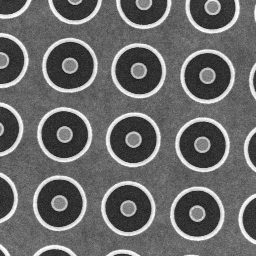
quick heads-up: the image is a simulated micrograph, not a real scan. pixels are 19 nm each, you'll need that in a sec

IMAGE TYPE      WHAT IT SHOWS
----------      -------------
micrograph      an array of small figures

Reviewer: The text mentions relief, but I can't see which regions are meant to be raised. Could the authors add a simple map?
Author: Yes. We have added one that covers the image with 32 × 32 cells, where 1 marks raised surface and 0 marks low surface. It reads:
00011100000011100110011100100011
00111110000011100000011100100011
11111111000111110000111100000111
11111111111111111111111110001111
01111111111111111111111111111111
00111110001111111111111111111111
00011100000111100001111110111111
10011100100011100000111100001111
00011100100011000100111000000111
00011100000011000100111001100111
01111110000111100000111000000110
11111111111111110001111100001111
11111111111111111111111110011111
01111111111111111111111111111111
00111100001111110011111111111111
00011000000111000001111100011111
00011001100111000000111000001111
00111000000111001000110001001110
01111100000111000000110001001110
11111100001111000001111000001110
11111111111111110111111000011110
11111111111111111111111111111111
01111100011111111111111111111111
00111000001111000011111111111111
00111000001110000001111000011111
00110001000110001001110000011110
01111000001110011001110010001100
11111000001110000001110010001100
11111110111111000011110000011100
11111111111111111111111000111110
11111111111111111111111111111111
01111000011111111111111111111111